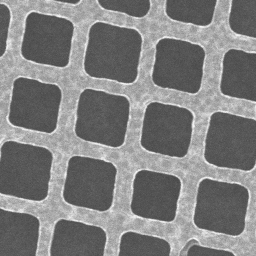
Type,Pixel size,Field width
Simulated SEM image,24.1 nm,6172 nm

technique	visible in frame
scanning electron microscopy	a regular array of holes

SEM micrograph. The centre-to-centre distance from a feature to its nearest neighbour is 1610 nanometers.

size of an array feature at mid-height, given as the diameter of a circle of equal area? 1.33 microns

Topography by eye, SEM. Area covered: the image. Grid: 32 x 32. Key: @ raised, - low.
@@@@@@@@@@@@-------@@------@@---
-@@@@@@@@@@@@@@----@@------@@---
-@@------@@@@@@@@@@@@@----@@@---
-@@------@@-----@@@@@@@@@@@@@---
-@@------@@-------@@@@@@@@@@@@@-
-@@------@@-------@@----@@@@@@@@
-@@------@@-------@-------@@---@
@@@------@@------@@-------@@----
@@@@@@@@@@@------@@------@@@----
@@@@@@@@@@@------@@------@@@----
@@----@@@@@@@@@@@@@------@@@----
@@------@@---@@@@@@@@@@--@@@----
@-------@@------@@@@@@@@@@@@@@@-
@------@@@------@@-----@@@@@@@@@
@------@@@------@@------@@----@@
@@-----@@-------@@------@@------
@@@@@--@@-------@@------@@------
@@@@@@@@@@@-----@@------@@------
------@@@@@@@@@@@@------@@------
-------@@-@@@@@@@@@@@--@@@------
-------@@-----@@@@@@@@@@@@------
------@@-------@@---@@@@@@@@@@@@
------@@------@@@-----@@@--@@@@@
------@@------@@@------@@------@
@-----@@------@@@-----@@@------@
@@@@@@@@@-----@@------@@-------@
--@@@@@@@@@@@@@@@-----@@-------@
-----@@--@@@@@@@@@@---@@-------@
-----@@------@@@@@@@@@@@@------@
-----@@------@@----@@@@@@@@@@@@@
-----@-------@@------@@@@@@@@@@@
-----@-------@@------@@------@@@